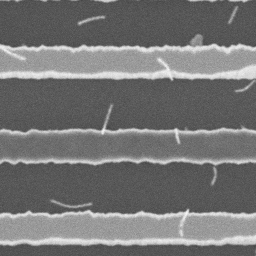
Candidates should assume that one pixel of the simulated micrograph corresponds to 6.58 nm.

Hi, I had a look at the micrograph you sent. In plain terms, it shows lines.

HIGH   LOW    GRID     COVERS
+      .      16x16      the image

................
................
................
++++++++++++++++
++++++++++++++++
................
................
................
++++++++++++++++
++++++++++++++++
................
................
................
++++++++++++++++
++++++++++++++++
................